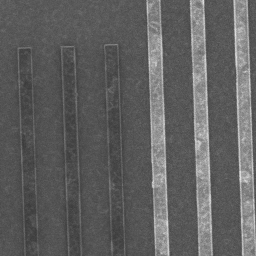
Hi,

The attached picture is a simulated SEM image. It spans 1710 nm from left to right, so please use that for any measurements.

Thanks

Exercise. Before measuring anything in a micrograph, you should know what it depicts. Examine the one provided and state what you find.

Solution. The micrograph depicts parallel lines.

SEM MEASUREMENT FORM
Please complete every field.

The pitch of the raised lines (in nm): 291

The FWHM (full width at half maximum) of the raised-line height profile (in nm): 90.1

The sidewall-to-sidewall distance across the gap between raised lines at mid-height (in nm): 204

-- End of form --